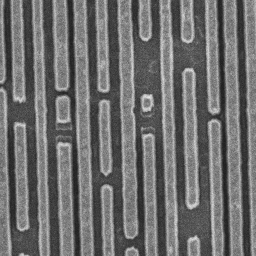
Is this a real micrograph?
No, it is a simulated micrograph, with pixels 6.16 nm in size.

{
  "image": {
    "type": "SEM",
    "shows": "parallel lines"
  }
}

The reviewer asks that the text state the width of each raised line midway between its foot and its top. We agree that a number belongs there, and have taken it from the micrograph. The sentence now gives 67.7 nm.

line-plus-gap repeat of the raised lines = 131 nm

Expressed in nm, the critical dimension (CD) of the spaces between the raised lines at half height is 62.3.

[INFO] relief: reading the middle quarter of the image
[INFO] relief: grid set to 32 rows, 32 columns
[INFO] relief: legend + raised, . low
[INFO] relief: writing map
+..+++...++...+++.......+++.....
+..+++...++...+++........++....+
+..+++...++...+++........++...++
+..+++...++...+++........++...++
+..+++...++...+++........++...++
+..+++...++...+++........++...++
...+++...++...+++........++...++
...+++........+++........++...++
+..+++........+++...++...++...++
+..+++...++...+++...++...++...++
+..+++...++...+++...++...++...++
+..+++...++...+++...+....++...++
+..+++...++...+++........++...++
+..+++...++...++++.......++...++
...+++...++...++++.......++...++
...+++...++...++++.......+++..++
...+++...++....+++.......+++..++
...+++...++....+++.......+++..++
...+++...++....+++..++...++...++
...+++...++....+++..++...++...++
++.+++...++....+++..++...++...++
++..+++..+++...+++..++...++...++
++..+++..+++...+++..++...+++..++
++..++...+++...+++..++...+++...+
++..+++..+++...+++..+++..+++...+
++..+++..+++...+++..+++..+++...+
++..+++..+++...+++..+++..+++...+
++..+++...+....+++..+++..+++...+
++..+++........+++..+++..+++...+
++..+++........+++..+++..+++...+
++..+++...+....+++..+++..+++...+
++..+++..+++...+++..+++..+++...+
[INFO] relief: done